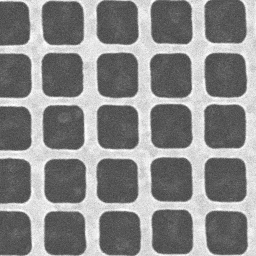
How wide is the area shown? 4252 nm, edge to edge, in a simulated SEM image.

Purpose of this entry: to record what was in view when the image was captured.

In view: a regular array of holes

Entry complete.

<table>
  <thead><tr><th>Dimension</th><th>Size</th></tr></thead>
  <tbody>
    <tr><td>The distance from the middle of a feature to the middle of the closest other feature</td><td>869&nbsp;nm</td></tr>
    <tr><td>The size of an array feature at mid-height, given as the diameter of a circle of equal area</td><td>0.792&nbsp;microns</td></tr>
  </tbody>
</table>